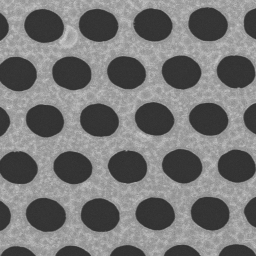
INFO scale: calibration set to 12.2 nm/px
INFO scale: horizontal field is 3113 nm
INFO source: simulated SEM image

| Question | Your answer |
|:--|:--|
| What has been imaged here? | a regular array of holes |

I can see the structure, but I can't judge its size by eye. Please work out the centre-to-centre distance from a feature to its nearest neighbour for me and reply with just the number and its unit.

660 nanometres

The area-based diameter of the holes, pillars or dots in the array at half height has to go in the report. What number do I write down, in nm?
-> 437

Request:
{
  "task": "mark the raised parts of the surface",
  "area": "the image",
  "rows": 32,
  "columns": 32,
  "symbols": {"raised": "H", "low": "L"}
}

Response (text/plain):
HHHHHHHHHHHHHHHHHHHHHHHHHHHHHHHH
HHHHLLLHHHHLLLHHHHLLHHHHLLLLHHHL
LHHLLLLLHHLLLLLHHLLLLHHHLLLLHHHL
LHHLLLLLHHLLLLLHHLLLLLHHLLLLHHHL
LHHHLLLLHHHLLLHHHHLLLHHHLLLLHHHL
HHHHHHHHHHHHHHHHHHHHHHHHHHHHHHHH
HHHHHHHHHHHHHHHHHHHHHHHHHHHHHHHH
HLLHHHHLLLHHHHLLLHHHHLLLHHHHLLLH
LLLLHHHLLLLHHLLLLLHHLLLLLHHLLLLL
LLLLLHHLLLLHHLLLLLHHLLLLLHHLLLLL
LLLLHHHLLLLHHHLLLLHHHLLLHHHHLLLH
HHHHHHHHHHHHHHHHHHHHHHHHHHHHHHHH
HHHHHHHHHHHHHHHHHHHHHHHHHHHHHHHH
HHHHLLLHHHHLLLHHHLLLLHHHLLLLHHHL
LHHLLLLLHHLLLLLHHLLLLLHHLLLLHHHL
LHHLLLLLHHLLLLLHHLLLLLHHLLLLLHHL
LHHHLLLHHHHLLLHHHHLLLHHHHLLLHHHL
HHHHHHHHHHHHHHHHHHHHHHHHHHHHHHHH
HHHHHHHHHHHHHHHHHHHHHHHHHHHHHHHH
HLLLHHHLLLLHHHLLLLHHHLLLLHHHLLLH
LLLLLHHLLLLHHHLLLLHHLLLLLHHLLLLL
LLLLLHHLLLLHHHLLLLHHHLLLLHHLLLLL
HLLLHHHHLLLHHHHLLLHHHHLLHHHHHLLH
HHHHHHHHHHHHHHHHHHHHHHHHHHHHHHHH
HHHHHHHHHHHHHHHHHHHHHHHHHHHHHHHH
LHHHLLLHHHHLLLHHHLLLLHHHLLLLHHHL
LHHLLLLLHHLLLLLHHLLLLLHHLLLLLHHL
LHHLLLLLHHLLLLLHHLLLLLHHLLLLLHHL
LHHHLLLHHHHLLLHHHHHLLHHHHLLLHHHH
HHHHHHHHHHHHHHHHHHHHHHHHHHHHHHHH
HHHHHHHHHHHHHHHHHHHHHHHHHHHHHHHH
LLLLHHHLLLLHHHLLLLHHHLLLLHHHLLLL